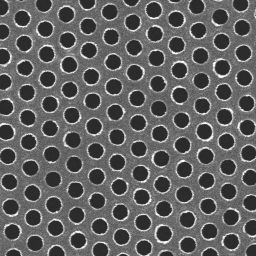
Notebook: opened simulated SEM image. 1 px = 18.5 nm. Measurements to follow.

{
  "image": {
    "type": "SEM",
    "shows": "a regular array of holes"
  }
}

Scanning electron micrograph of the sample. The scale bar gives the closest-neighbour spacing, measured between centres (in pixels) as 24.4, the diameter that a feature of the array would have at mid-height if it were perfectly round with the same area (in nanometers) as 288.